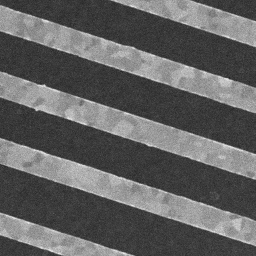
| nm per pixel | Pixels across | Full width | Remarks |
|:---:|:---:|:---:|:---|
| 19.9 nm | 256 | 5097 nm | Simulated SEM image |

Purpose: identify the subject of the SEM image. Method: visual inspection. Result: one or a few lines or trenches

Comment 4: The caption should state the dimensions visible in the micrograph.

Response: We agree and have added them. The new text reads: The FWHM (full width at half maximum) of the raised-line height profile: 476 nm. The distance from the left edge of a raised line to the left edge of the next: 1270 nm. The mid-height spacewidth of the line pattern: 786 nanometers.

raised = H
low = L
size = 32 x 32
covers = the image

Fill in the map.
LLLLLLLLLLLLLLLHHHHHHHHHHLLLLLLL
HHLLLLLLLLLLLLLLLLLHHHHHHHHHLLLL
HHHHHHLLLLLLLLLLLLLLLLHHHHHHHHHL
HHHHHHHHHLLLLLLLLLLLLLLLLHHHHHHH
LLHHHHHHHHHHLLLLLLLLLLLLLLLLHHHH
LLLLLHHHHHHHHHHLLLLLLLLLLLLLLLLH
LLLLLLLLHHHHHHHHHHLLLLLLLLLLLLLL
LLLLLLLLLLLHHHHHHHHHHLLLLLLLLLLL
LLLLLLLLLLLLLLHHHHHHHHHHLLLLLLLL
HLLLLLLLLLLLLLLLLLHHHHHHHHHLLLLL
HHHHLLLLLLLLLLLLLLLLLHHHHHHHHHLL
HHHHHHHHLLLLLLLLLLLLLLLLHHHHHHHH
LHHHHHHHHHHLLLLLLLLLLLLLLLLHHHHH
LLLLHHHHHHHHHHLLLLLLLLLLLLLLLLHH
LLLLLLLHHHHHHHHHHLLLLLLLLLLLLLLL
LLLLLLLLLLHHHHHHHHHHLLLLLLLLLLLL
LLLLLLLLLLLLLHHHHHHHHHHLLLLLLLLL
HLLLLLLLLLLLLLLLLHHHHHHHHHLLLLLL
HHHHLLLLLLLLLLLLLLLLHHHHHHHHHLLL
HHHHHHHLLLLLLLLLLLLLLLLHHHHHHHHH
HHHHHHHHHHLLLLLLLLLLLLLLLLHHHHHH
LLLHHHHHHHHHHLLLLLLLLLLLLLLLLHHH
LLLLLLHHHHHHHHHHLLLLLLLLLLLLLLLL
LLLLLLLLLLHHHHHHHHHLLLLLLLLLLLLL
LLLLLLLLLLLLLHHHHHHHHHLLLLLLLLLL
LLLLLLLLLLLLLLLLHHHHHHHHHLLLLLLL
LLLLLLLLLLLLLLLLLLLHHHHHHHHHLLLL
HHHLLLLLLLLLLLLLLLLLLLHHHHHHHHHH
HHHHHHLLLLLLLLLLLLLLLLLLLHHHHHHH
HHHHHHHHHLLLLLLLLLLLLLLLLLLLHHHH
LLLLHHHHHHHHLLLLLLLLLLLLLLLLLLLH
LLLLLLLHHHHHHHHLLLLLLLLLLLLLLLLL